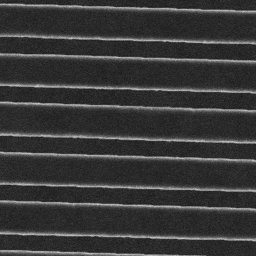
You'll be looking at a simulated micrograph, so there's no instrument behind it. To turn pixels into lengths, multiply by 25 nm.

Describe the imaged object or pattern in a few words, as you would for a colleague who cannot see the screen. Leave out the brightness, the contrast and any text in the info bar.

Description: lines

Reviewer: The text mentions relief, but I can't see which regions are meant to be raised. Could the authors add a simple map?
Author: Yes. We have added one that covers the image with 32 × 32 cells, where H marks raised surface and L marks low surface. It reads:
LLLLLLLLLLLLLLLLLLLLLLLLLLLLLLLL
HHHHHHHHHHHHHHHHHHHHHHHHHHHHHHHH
HHHHHHHHHHHHHHHHHHHHHHHHHHHHHHHH
HHHHHHHHHHHHHHHHHHHHHHHHHHHHHHHH
HHHHHHHHHHHHHHHHHHHHHHHHHHHHHHHH
LLLLLLLLLLLLLLLLLLLLLLLLLLLLLLLL
LLLLLLLLLLLLLLLLLLLLLLLLLLLLLLLL
HHHHHHHHHHHHHHHHHHHHHHHHHLLLLLLL
HHHHHHHHHHHHHHHHHHHHHHHHHHHHHHHH
HHHHHHHHHHHHHHHHHHHHHHHHHHHHHHHH
HHHHHHHHHHHHHHHHHHHHHHHHHHHHHHHH
LLLLLLLLLLLLLLLLLLLLLLLLLLLLLLLH
LLLLLLLLLLLLLLLLLLLLLLLLLLLLLLLL
HHHHHHHHHHHHHHHHHHHHLLLLLLLLLLLL
HHHHHHHHHHHHHHHHHHHHHHHHHHHHHHHH
HHHHHHHHHHHHHHHHHHHHHHHHHHHHHHHH
HHHHHHHHHHHHHHHHHHHHHHHHHHHHHHHH
LLLLLLLLLLLLLLLLLLHHHHHHHHHHHHHH
LLLLLLLLLLLLLLLLLLLLLLLLLLLLLLLL
HHHHHHHHHHHHHHLLLLLLLLLLLLLLLLLL
HHHHHHHHHHHHHHHHHHHHHHHHHHHHHHHH
HHHHHHHHHHHHHHHHHHHHHHHHHHHHHHHH
HHHHHHHHHHHHHHHHHHHHHHHHHHHHHHHH
LLLLLLLLLLLLLLLLLHHHHHHHHHHHHHHH
LLLLLLLLLLLLLLLLLLLLLLLLLLLLLLLL
HHHHHHHHHHHHLLLLLLLLLLLLLLLLLLLL
HHHHHHHHHHHHHHHHHHHHHHHHHHHHHHHH
HHHHHHHHHHHHHHHHHHHHHHHHHHHHHHHH
HHHHHHHHHHHHHHHHHHHHHHHHHHHHHHHH
LLLLLLLLLLLLLHHHHHHHHHHHHHHHHHHH
LLLLLLLLLLLLLLLLLLLLLLLLLLLLLLLL
HHHHHHHLLLLLLLLLLLLLLLLLLLLLLLLL